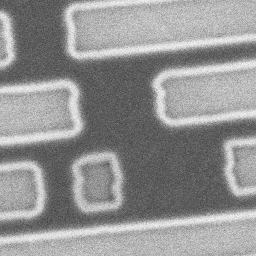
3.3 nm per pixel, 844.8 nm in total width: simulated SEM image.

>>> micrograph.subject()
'one or a few lines or trenches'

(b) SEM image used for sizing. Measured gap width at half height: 47.2 px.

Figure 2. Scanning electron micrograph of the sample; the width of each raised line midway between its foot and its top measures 92.6 nanometers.